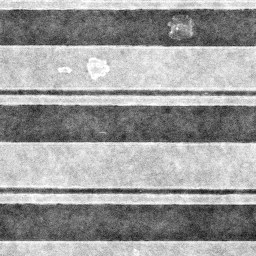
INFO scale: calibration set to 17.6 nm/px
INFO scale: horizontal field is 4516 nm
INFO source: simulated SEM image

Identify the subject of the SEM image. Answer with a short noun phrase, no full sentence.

lines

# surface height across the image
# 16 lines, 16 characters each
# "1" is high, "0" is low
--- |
1111101100100000
0000000000000000
0000000000000000
1111111111111111
1111111111111111
1111111111111111
0000001111111111
0000000000000000
0000000000000000
1111111111111111
1111111111111111
1111111111111111
1111111111111111
0000000000000000
0000000000000000
1111111111111111